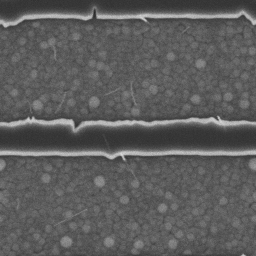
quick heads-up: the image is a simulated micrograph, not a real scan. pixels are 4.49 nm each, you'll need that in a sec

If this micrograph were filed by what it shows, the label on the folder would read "one or a few lines or trenches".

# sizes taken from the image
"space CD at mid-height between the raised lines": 469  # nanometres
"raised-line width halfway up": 0.145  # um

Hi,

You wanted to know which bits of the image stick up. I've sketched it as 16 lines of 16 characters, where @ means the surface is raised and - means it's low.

@@@@@@@@@@@@@@@@
@---------------
----------------
----------------
----------------
----------------
----------------
-----------@----
@@@@@@@@@@@@@@@@
@@@@@@@@@@@@@@@@
----------------
----------------
----------------
----------------
----------------
----------------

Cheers